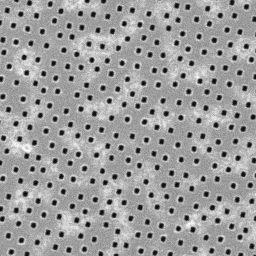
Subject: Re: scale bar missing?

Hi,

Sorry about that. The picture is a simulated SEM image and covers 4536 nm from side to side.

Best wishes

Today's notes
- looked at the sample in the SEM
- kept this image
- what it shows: a regular array of holes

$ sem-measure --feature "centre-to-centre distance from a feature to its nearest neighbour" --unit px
13.3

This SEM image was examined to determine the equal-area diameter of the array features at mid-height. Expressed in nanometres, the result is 106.